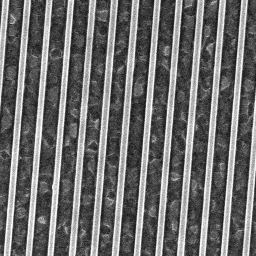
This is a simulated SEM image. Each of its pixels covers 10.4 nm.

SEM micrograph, parallel lines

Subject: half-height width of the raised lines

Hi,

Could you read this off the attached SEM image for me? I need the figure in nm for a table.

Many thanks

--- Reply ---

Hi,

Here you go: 60.7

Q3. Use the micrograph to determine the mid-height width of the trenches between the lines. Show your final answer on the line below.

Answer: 170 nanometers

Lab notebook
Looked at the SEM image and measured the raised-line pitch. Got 0.224 um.